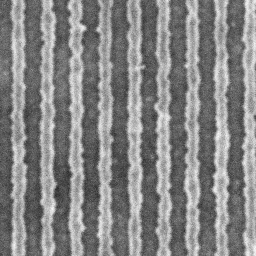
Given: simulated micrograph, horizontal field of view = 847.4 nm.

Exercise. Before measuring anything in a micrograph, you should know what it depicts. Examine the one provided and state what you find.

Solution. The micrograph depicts parallel lines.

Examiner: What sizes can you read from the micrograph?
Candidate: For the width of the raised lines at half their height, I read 10.8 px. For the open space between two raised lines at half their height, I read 0.0617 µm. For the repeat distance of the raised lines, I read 95.9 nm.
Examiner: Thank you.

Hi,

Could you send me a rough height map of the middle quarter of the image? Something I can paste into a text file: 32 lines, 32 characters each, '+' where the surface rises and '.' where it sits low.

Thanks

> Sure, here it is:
..+++....+++.....+++....++.....+
..+++....++.....+++.....++.....+
..++.....+++.....++.....++.....+
..++.....++.....+++....+++.....+
..++.....++.....+++....+++.....+
..++.....++.....+++.....++.....+
..++.....+++.....++.....++.....+
..++.....+++....+++.....++.....+
..++.....+++....+++.....+++....+
..++.....+++....+++.....++.....+
..+++....+++....+++....+++.....+
..+++....+++....+++....+++.....+
..+++....+++....+++.....++.....+
..++.....+++....+++.....++.....+
..++.....+++....+++....+++.....+
..++.....++.....+++.....++....++
..++.....++.....+++....+++.....+
..++.....++.....+++.....++.....+
.+++.....+++....+++.....++.....+
..++.....+++.....++....+++.....+
..++.....++......++....+++.....+
..++.....+++....+++....+++.....+
..++.....+++....+++....+++.....+
.+++.....+++....+++.....++.....+
.++++....+++....+++....+++.....+
..++.....+++.....++....+++.....+
..++.....+++....+++....+++.....+
..+++....+++....+++.....++.....+
..+++....+++....+++.....++.....+
..+++....++.....+++.....++.....+
..++.....++.....+++.....++.....+
..++.....+++....+++....+++.....+